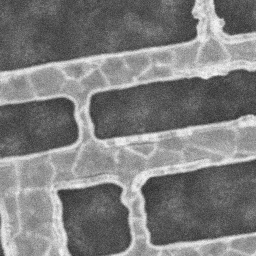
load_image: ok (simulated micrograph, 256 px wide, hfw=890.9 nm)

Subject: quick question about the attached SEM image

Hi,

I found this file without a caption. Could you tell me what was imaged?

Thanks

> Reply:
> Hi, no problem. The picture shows one or a few lines or trenches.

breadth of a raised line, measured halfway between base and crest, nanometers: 125